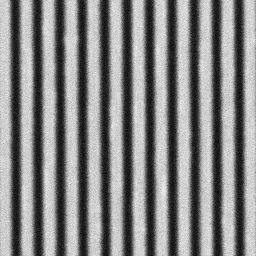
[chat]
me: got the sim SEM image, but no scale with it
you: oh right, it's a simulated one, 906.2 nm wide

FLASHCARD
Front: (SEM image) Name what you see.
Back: parallel lines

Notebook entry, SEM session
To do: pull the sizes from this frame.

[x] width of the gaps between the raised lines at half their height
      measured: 37.2 nm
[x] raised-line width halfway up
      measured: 0.0407 microns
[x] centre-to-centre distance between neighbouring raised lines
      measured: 79.2 nm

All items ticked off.